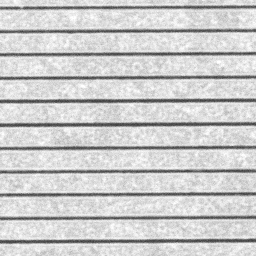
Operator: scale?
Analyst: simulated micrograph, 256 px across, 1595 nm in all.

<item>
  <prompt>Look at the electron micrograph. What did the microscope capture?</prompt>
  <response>parallel lines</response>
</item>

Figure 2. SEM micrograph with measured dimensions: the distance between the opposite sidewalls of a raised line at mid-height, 113 nm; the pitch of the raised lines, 0.145 um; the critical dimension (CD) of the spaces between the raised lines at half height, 0.0343 micrometres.